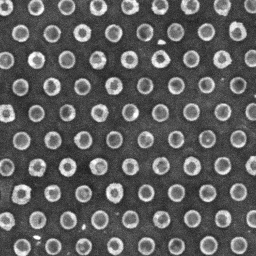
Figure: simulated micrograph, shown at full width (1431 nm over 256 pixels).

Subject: a regular array of raised bodies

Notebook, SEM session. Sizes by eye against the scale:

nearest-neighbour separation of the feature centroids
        0.169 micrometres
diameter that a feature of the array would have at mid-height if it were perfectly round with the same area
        88.8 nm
